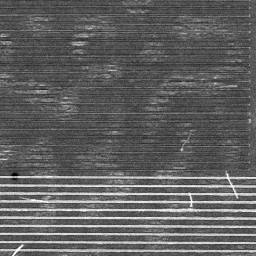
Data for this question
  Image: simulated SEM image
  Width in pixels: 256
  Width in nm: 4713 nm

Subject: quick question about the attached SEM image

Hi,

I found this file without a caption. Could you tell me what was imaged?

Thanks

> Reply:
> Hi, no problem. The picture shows parallel lines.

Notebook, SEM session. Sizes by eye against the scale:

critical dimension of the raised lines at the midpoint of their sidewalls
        34.5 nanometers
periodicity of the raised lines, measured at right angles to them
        149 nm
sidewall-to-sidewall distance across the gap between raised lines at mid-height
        0.12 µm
